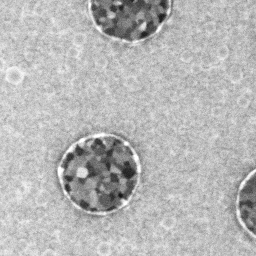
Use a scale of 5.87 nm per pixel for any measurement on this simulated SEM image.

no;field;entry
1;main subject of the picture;raised bodies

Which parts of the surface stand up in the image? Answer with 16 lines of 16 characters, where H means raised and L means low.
LLLLLLHHHHHLLLLL
LLLLLLHHHHLLLLLL
LLLLLLLHHLLLLLLL
LLLLLLLLLLLLLLLL
LLLLLLLLLLLLLLLL
LLLLLLLLLLLLLLLL
LLLLLLLLLLLLLLLL
LLLLLLLLLLLLLLLL
LLLLLLHLLLLLLLLL
LLLLHHHHLLLLLLLL
LLLLHHHHHLLLLLLL
LLLLHHHHHLLLLLLH
LLLLHHHHLLLLLLLH
LLLLLLLLLLLLLLLH
LLLLLLLLLLLLLLLL
LLLLLLLLLLLLLLLL